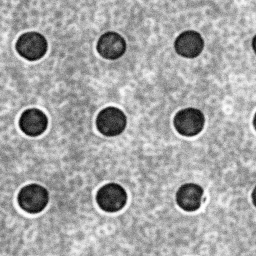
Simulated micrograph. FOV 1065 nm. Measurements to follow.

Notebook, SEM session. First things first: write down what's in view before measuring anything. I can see a regular array of holes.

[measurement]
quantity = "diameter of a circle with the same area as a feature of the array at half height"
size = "132 nanometres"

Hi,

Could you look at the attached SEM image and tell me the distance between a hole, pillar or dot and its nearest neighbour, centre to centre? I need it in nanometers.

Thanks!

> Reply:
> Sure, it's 316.